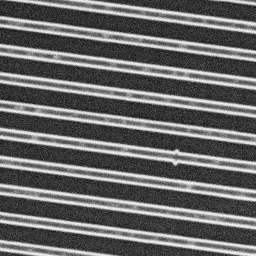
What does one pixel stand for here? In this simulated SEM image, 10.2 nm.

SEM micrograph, parallel lines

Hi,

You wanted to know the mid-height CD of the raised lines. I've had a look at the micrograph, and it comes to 0.0889 µm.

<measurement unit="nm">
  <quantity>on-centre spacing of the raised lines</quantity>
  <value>284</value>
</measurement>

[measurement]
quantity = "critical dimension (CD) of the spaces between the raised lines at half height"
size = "19.2 pixels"